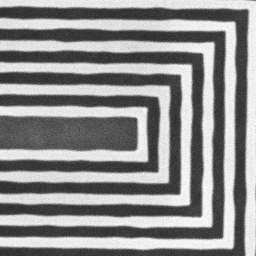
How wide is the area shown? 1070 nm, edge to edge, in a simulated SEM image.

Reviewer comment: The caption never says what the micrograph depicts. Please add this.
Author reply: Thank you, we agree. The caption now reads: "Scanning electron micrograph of groups of lines, slits or small figures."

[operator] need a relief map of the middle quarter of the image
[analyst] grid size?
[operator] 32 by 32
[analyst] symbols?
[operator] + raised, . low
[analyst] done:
++++++++++++++++++++++++++++++++
++++++++++++++++++++++++++++++++
.............................+++
..............................++
..............................++
++++++++++++.........+........++
++++++++++++++++++++++++++....++
.......+++++++++++++++++++....++
........................++....++
........................++....++
........................++....++
+++++++++++++++++++++...++...+++
+++++++++++++++++++++...++...+++
..................+++...++....++
...................++...++....++
...................++...++....++
...................++...++....++
...................++...++...+++
...................++...++...+++
...................++...++...+++
...................++...++...++.
..................+++...++...++.
+++++++++++++++++++++...++...++.
+++++++++++++++++++++...++...++.
........................++....+.
........................++....+.
........................++....+.
++++++++++++++++++++++++++....+.
++++++++++++++++++++++++++....+.
...+++...........+++++++++...++.
.............................++.
.............................++.